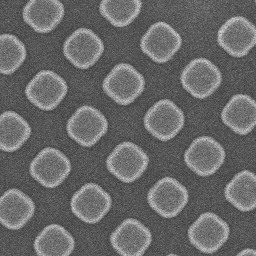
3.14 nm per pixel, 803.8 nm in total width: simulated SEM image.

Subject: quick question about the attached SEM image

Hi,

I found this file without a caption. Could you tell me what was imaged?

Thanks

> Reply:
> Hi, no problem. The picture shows a regular array of raised bodies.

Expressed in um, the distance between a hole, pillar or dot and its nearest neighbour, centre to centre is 0.17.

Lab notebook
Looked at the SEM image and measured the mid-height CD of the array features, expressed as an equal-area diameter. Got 0.115 microns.